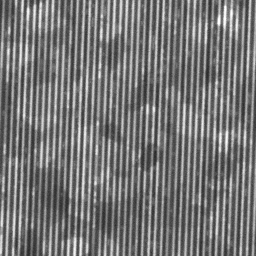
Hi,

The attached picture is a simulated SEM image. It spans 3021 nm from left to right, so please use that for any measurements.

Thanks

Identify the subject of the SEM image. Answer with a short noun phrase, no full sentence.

parallel lines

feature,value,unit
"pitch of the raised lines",0.0726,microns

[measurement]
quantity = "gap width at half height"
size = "51.6 nm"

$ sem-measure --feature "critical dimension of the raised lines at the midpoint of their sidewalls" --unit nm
20.6